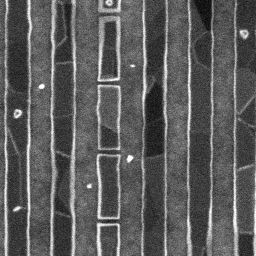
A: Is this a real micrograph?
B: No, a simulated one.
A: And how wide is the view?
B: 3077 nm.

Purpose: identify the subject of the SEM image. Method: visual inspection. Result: wiring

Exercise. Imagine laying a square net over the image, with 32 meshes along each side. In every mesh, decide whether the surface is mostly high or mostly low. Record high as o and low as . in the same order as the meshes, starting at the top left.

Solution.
.ooo...oo....oo...ooo...ooo..ooo
.ooo...oo.........ooo...ooo..ooo
.ooo...oo....oo...ooo...ooo..ooo
.ooo...oo....oo...ooo...oo...ooo
.ooo...oo....oo...ooo...ooo..ooo
.ooo...oo....oo...ooo...ooo..ooo
.ooo...oo....oo...ooo...ooo..ooo
.ooo...oo....oo...ooo...ooo..ooo
.ooo...oo....oo...ooo...ooo..ooo
.ooo...oo...ooo...ooo...ooo..ooo
.ooo...oo.........ooo...ooo..ooo
.ooo...oo...ooo...ooo...oo...ooo
.ooo...oo...ooo...ooo...ooo..ooo
.ooo..ooo...ooo...ooo...ooo..ooo
.ooo..ooo...ooo...ooo...ooo..ooo
.ooo...oo...ooo...ooo...oo...ooo
.ooo...oo...ooo...ooo...oo...ooo
.ooo...oo...ooo...ooo...oo...ooo
.ooo...oo....oo...ooo...oo...ooo
.oo....oo...ooo...ooo...oo...ooo
.oo....oo...ooo...ooo...oo...ooo
.oo....oo...ooo...ooo...oo...ooo
.ooo...oo...ooo...ooo...oo...ooo
.ooo...oo....oo...ooo...oo...ooo
.ooo...oo....oo...ooo...oo...ooo
.ooo...oo...ooo...ooo...oo...ooo
.ooo...oo...ooo...ooo...oo...ooo
.ooo...oo.........ooo...oo...ooo
.ooo...oo...ooo...ooo...oo...ooo
.oo....oo...ooo...ooo...oo...ooo
.ooo...oo...ooo...ooo...oo...ooo
.ooo...oo...ooo...ooo...oo...ooo